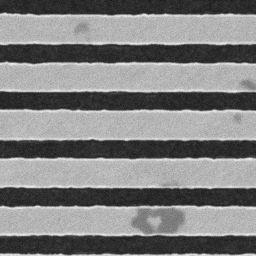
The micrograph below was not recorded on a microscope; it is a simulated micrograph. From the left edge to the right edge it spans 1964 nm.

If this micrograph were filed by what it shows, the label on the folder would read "lines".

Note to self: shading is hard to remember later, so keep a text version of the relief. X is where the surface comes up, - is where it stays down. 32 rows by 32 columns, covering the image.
--------------------------------
--------------------------------
XXXXXXXXXXXXXXXXXXXXXXXXXXXXXXXX
XXXXXXXXXXXXXXXXXXXXXXXXXXXXXXXX
XXXXXXXXXXXXXXXXXXXXXXXXXXXXXXXX
X-X--XXX---XX-XXXXX-XXX---XXXXXX
--------------------------------
--------------------------------
XXXXXXXXXXXXXXXXXXXXXXXXXXXXXXXX
XXXXXXXXXXXXXXXXXXXXXXXXXXXXXXXX
XXXXXXXXXXXXXXXXXXXXXXXXXXXXXXXX
------------------X---------XX--
--------------------------------
--------------------------------
XXXXXXXXXXXXXXXXXXXXXXXXXXXXXXXX
XXXXXXXXXXXXXXXXXXXXXXXXXXXXXXXX
XXXXXXXXXXXXXXXXXXXXXXXXXXXXXXXX
X-X-XX-X-X--X--X---XX-XX-X-XXXXX
--------------------------------
--------------------------------
XXXXXXXXXXXXXXXXXXXXXXXXXXXXXXXX
XXXXXXXXXXXXXXXXXXXXXXXXXXXXXXXX
XXXXXXXXXXXXXXXXXXXXXXXXXXXXXXXX
-----------------X---XXXX-X---XX
--------------------------------
--------------------------------
XXXXXXXXXXXXXXXXXXXXXXXXXXXXXXXX
XXXXXXXXXXXXXXXXXXXXXXXXXXXXXXXX
XXXXXXXXXXXXXXXXXXXXXXXXXXXXXXXX
--------------------------------
--------------------------------
--------------------------------